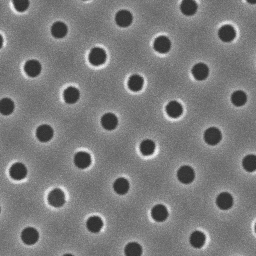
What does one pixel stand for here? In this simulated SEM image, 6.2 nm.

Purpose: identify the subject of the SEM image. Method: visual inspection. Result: a regular array of holes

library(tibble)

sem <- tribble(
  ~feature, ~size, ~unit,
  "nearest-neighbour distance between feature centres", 46.1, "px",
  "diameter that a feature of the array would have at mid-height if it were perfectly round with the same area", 0.115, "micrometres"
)